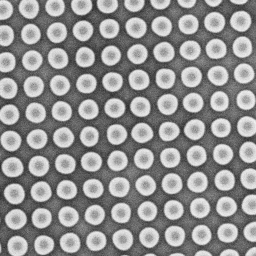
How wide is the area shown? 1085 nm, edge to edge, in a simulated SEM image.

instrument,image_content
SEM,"an array of small figures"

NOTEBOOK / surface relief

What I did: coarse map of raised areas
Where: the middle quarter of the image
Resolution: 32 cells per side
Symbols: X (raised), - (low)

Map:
----XX--------------------------
------------------------XX----XX
-----------XX----XXXX--XXXXX-XXX
X---XXXX--XXXX--XXXXX--XXXXX--XX
X--XXXXX--XXXXX-XXXXX--XXXXX--XX
X--XXXXX--XXXX---XXXX---XXX----X
X---XXX----XX-------------------
-------------------------------X
------------------XX----XXXX--XX
-----XXX---XXXX--XXXX--XXXXX--XX
X---XXXX--XXXXX--XXXX---XXXX--XX
XX--XXXX--XXXXX--XXXX---XXXX---X
XX--XXXX---XXXX---XXX----XX-----
X----XX-------------------------
-------------------------------X
------------XX----XXX---XXXX--XX
X----XXX---XXXX--XXXXX--XXXXX-XX
XX--XXXX---XXXXX-XXXXX--XXXXX-XX
XX--XXXX---XXXX--XXXXX--XXXX---X
XX---XXX---XXXX----X------------
X-----X-------------------------
-------------------XX----XXX---X
------XX----XXX---XXXX--XXXXX--X
XX---XXXX--XXXXX--XXXX--XXXXX--X
XXX-XXXXX--XXXXX--XXXX--XXXXX--X
XXX--XXXX--XXXX---XXXX---XXX----
XX----XX----XX------------------
--------------------------XX----
-------------XX----XXX---XXXX--X
XX----XXX---XXXX--XXXXX--XXXX--X
XXX--XXXXX-XXXXX--XXXXX--XXXX--X
XXX--XXXXX-XXXXX--XXXXX--XXXX---